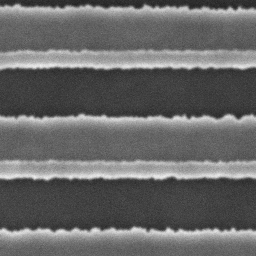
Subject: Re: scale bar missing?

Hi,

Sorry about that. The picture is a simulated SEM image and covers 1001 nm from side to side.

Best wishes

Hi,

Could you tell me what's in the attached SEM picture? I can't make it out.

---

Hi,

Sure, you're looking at lines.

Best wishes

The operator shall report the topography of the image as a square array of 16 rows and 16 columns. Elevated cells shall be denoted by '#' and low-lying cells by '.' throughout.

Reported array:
########.##.....
################
################
################
................
................
................
################
################
################
################
................
................
................
################
################